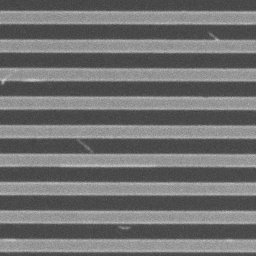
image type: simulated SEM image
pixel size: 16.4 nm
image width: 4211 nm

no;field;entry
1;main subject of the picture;parallel lines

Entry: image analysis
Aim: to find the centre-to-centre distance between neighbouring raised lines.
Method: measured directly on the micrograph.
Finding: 0.469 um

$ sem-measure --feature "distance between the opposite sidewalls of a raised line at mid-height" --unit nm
206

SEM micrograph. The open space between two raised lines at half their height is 0.261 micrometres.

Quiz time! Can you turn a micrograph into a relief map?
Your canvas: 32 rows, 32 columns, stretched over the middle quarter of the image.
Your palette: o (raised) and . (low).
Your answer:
................................
oooooooooooooooooooooooooooooooo
oooooooooooooooooooooooooooooooo
oooooooooooooooooooooooooooooooo
................................
................................
................................
................................
oooooooooooooooooooooooooooooooo
oooooooooooooooooooooooooooooooo
oooooooooooooooooooooooooooooooo
................................
................................
................................
................................
................................
oooooooooooooooooooooooooooooooo
oooooooooooooooooooooooooooooooo
................................
................................
................................
................................
................................
oooooooooooooooooooooooooooooooo
oooooooooooooooooooooooooooooooo
oooooooooooooooooooooooooooooooo
................................
................................
................................
................................
oooooooooooooooooooooooooooooooo
oooooooooooooooooooooooooooooooo